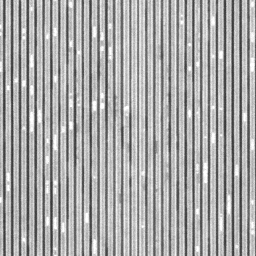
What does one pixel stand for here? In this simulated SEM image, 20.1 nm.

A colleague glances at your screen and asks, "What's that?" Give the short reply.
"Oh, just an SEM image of parallel lines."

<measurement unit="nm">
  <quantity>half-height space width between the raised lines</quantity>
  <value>60.3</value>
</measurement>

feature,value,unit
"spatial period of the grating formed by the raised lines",158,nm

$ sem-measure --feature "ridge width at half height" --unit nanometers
98